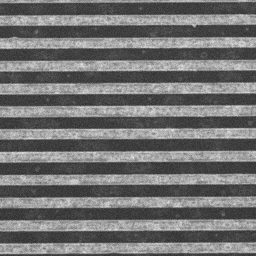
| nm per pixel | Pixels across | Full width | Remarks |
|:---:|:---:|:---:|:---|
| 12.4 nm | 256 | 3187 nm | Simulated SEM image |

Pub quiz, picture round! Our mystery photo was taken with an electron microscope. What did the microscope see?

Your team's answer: parallel lines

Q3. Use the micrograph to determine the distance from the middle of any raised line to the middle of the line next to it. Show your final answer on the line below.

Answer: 284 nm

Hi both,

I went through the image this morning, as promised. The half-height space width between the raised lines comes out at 166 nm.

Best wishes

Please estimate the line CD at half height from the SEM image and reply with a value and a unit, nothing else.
124 nm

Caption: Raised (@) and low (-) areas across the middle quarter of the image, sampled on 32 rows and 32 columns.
@@@@@@@@@@@@@@@@@@@@@@@@@@@@@@@@
@@@@@@@@@@@@@@@@@@--------------
--------------------------------
--------------------------------
--------------------------------
@@@@@@@@@@@@@@@@@@@@@@@@@@@@@@@@
@@@@@@@@@@@@@@@@@@@@@@@@@@@@@@@@
--------------------------------
--------------------------------
--------------------------------
--------------------------------
@@@@@@@@@@@@@@@@@@@@@@@@@@@@@@@@
@@@@@@@@@@@@@@@@@@@@@@@@@@@@@@@@
--------------------------------
--------------------------------
--------------------------------
---@@@@@@@@@@@@@@@@@@@@@@@@@@@@@
@@@@@@@@@@@@@@@@@@@@@@@@@@@@@@@@
@@@@@@@@@@@@@@@@@---------------
--------------------------------
--------------------------------
--------------------------------
@@@@@@@@@@@@@@@@@@@@@@@@@@@@@@@@
@@@@@@@@@@@@@@@@@@@@@@@@@@@@@@@@
--------------------------------
--------------------------------
--------------------------------
--------------------------------
@@@@@@@@@@@@@@@@@@@@@@@@@@@@@@@@
@@@@@@@@@@@@@@@@@@@@@@@@@@@@@@@@
--------------------------------
--------------------------------